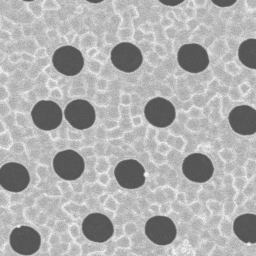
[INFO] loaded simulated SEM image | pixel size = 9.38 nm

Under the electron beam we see a regular array of holes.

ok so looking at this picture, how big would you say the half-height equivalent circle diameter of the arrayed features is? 30.9 px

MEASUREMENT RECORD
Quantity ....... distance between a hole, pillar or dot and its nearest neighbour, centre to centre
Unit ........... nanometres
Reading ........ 580